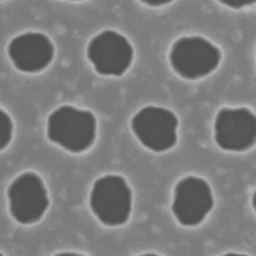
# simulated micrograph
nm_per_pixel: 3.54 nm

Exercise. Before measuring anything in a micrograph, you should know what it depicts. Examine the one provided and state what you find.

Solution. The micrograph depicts a regular array of holes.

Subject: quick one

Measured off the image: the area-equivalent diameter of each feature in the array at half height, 156 nm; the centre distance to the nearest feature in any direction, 286 nanometers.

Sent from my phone